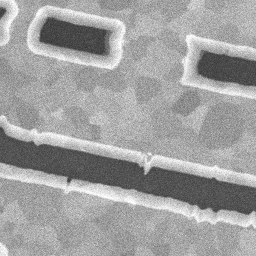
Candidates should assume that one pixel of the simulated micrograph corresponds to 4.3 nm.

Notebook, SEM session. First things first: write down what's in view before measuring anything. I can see one or a few lines or trenches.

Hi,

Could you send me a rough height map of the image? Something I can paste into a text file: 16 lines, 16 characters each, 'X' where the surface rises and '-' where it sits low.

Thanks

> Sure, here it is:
-XXXXXXXXXXXXXXX
XX-----XXXXXXXXX
XX-----XXXXXXXXX
XXXXX--XXXXX----
XXXXXXXXXXXX----
XXXXXXXXXXXXXX--
XXXXXXXXXXXXXXXX
XXXXXXXXXXXXXXXX
--XXXXXXXXXXXXXX
-------XXXXXXXXX
------------XXXX
XXXX------------
XXXXXXXXX-------
XXXXXXXXXXXXX---
XXXXXXXXXXXXXXXX
XXXXXXXXXXXXXXXX